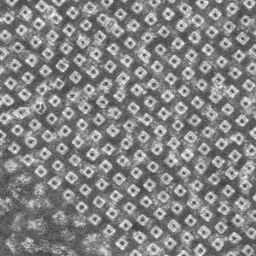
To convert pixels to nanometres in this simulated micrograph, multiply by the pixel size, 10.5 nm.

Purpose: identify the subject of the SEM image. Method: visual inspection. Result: holes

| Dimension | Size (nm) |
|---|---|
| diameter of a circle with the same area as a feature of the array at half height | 38.4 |